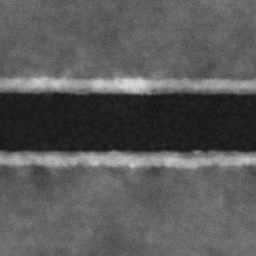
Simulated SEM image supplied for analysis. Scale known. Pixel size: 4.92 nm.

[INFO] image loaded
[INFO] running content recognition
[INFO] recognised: one or a few lines or trenches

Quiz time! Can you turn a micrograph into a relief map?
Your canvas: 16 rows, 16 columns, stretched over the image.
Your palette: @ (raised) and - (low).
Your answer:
@@@@@@@@@@@@@@@@
@@@@@@@@@@@@@@@@
@@@@@@@@@@@@@@@@
@@@@@@@@@@@@@@@@
@@@@@@@@@@@@@@@@
----------------
----------------
----------------
----------------
----------------
@@@@@@@@@@@@@@@@
@@@@@@@@@@@@@@@@
@@@@@@@@@@@@@@@@
@@@@@@@@@@@@@@@@
@@@@@@@@@@@@@@@@
@@@@@@@@@@@@@@@@